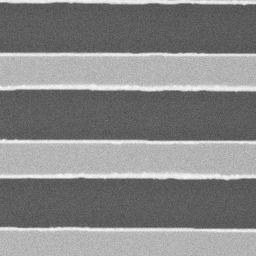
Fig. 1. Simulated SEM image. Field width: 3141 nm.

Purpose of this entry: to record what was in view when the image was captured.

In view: lines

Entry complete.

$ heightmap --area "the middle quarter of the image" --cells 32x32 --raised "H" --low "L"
HHHHHHHHHHHHHHHHHHHHHHHHHHHHHHHH
HHHHHHHHHHHHHHHHHHHHHHHHHHHHHHHH
HHHHHHHHHHHHHHHHHHHHHHHHHHHHHHHH
HHHHHHHHHHHHHHHHHHHHHHHHHHHHHHHH
HHHHHHHHHHHHHHHHHHHHHHHHHHHHHHHH
HHHHHHHHHHHHHHHHHHHHHHHHHHHHHHHH
LLLLLLLLLLLLLLLLLLLLHHHLLLLLLLLL
LLLLLLLLLLLLLLLLLLLLLLLLLLLLLLLL
LLLLLLLLLLLLLLLLLLLLLLLLLLLLLLLL
LLLLLLLLLLLLLLLLLLLLLLLLLLLLLLLL
LLLLLLLLLLLLLLLLLLLLLLLLLLLLLLLL
LLLLLLLLLLLLLLLLLLLLLLLLLLLLLLLL
LLLLLLLLLLLLLLLLLLLLLLLLLLLLLLLL
LLLLLLLLLLLLLLLLLLLLLLLLLLLLLLLL
LLLLLLLLLLLLLLLLLLLLLLLLLLLLLLLL
LLLLLLLLLLLLLLLLLLLLLLLLLLLLLLLL
LLLLLLLLLLLLLLLLLLLLLLLLLLLLLLLL
LLLLLLLLLLLLLLLLLLLLLLLLLLLLLLLL
LLLLLLLLLLLLLLLLLLLLLLLLLLLLLLLL
HHHHHHHHHHHHHHHHHHHHHHHHHHHHHHHH
HHHHHHHHHHHHHHHHHHHHHHHHHHHHHHHH
HHHHHHHHHHHHHHHHHHHHHHHHHHHHHHHH
HHHHHHHHHHHHHHHHHHHHHHHHHHHHHHHH
HHHHHHHHHHHHHHHHHHHHHHHHHHHHHHHH
HHHHHHHHHHHHHHHHHHHHHHHHHHHHHHHH
HHHHHHHHHHHHHHHHHHHHHHHHHHHHHHHH
HHHHHHHHHHHHHHHHHHHHHHHHHHHHHHHH
HHHHHHHHHHHHHHHHHHHHHHHHHHHHHHHH
LLLLLLLLLLLLLLLLLLLLLLLLLHLLHHHH
LLLLLLLLLLLLLLLLLLLLLLLLLLLLLLLL
LLLLLLLLLLLLLLLLLLLLLLLLLLLLLLLL
LLLLLLLLLLLLLLLLLLLLLLLLLLLLLLLL